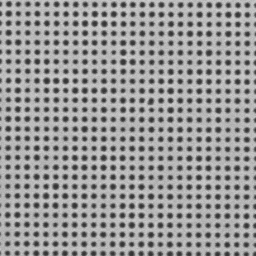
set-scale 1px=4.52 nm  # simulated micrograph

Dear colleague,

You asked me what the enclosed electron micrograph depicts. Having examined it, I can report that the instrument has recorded a regular array of holes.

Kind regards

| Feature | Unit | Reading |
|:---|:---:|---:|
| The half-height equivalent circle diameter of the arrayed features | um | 0.0274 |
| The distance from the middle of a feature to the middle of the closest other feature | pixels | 9.34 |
